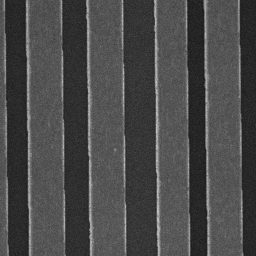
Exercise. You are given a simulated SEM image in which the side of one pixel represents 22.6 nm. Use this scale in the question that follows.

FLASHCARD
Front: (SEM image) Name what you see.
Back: lines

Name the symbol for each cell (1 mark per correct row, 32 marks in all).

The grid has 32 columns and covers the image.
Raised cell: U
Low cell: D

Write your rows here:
UDDUUUUUDDDUUUUDDDDUUUUDDDUUUUDD
UDDUUUUUDDDUUUUDDDDUUUUDDDUUUUDD
UDDUUUUUDDDUUUUDDDDUUUUDDDUUUUDD
UDDUUUUUDDDUUUUDDDDUUUUDDDUUUUDD
UDDUUUUUDDDUUUUDDDDUUUUDDDUUUUDD
UDDUUUUUDDDUUUUDDDDUUUUDDDUUUUDD
UDDUUUUUDDDUUUUDDDDUUUUDDDUUUUDD
UDDUUUUUDDDUUUUDDDDUUUUDDDUUUUDD
UDDUUUUUDDDUUUUDDDDUUUUDDDUUUUDD
UDDUUUUUDDDUUUUDDDDUUUUDDDUUUUDD
UDDUUUUUDDDUUUUDDDDUUUUDDDUUUUDD
UDDUUUUUDDDUUUUDDDDDUUUDDDUUUUDD
UDDUUUUUDDDUUUUDDDDDUUUDDDUUUUDD
UDDUUUUUDDDUUUUDDDDDUUUDDDUUUUDD
UDDUUUUUDDDUUUUDDDDDUUUDDDUUUUDD
UDDUUUUUDDDUUUUDDDDDUUUDDDUUUUDD
UDDDUUUUDDDUUUUDDDDDUUUDDDUUUUDD
UDDDUUUUDDDUUUUUDDDDUUUDDDUUUUDD
UDDDUUUUDDDUUUUUDDDDUUUUDDUUUUDD
UDDDUUUUDDDUUUUUDDDDUUUUDDUUUUDD
UDDDUUUUDDDUUUUUDDDDUUUUDDUUUUDD
UDDDUUUUDDDUUUUUDDDDUUUUDDUUUUDD
UDDDUUUUDDDUUUUUDDDDUUUUDDUUUUDD
UDDDUUUUDDDUUUUUDDDDUUUUDDUUUUDD
UDDDUUUUDDDUUUUUDDDDUUUUDDUUUUDD
UDDDUUUUDDDUUUUUDDDDUUUUDDUUUUDD
UDDDUUUUDDDUUUUUDDDDUUUUDDUUUUDD
UDDDUUUUDDDUUUUUDDDDUUUUDDUUUUDD
UDDDUUUUDDDUUUUUDDDDUUUUDDUUUUDD
UDDDUUUUDDDUUUUUDDDDUUUUDDUUUUDD
UDDDUUUUDDDUUUUUDDDDUUUUDDUUUUDD
UDDDUUUUDDDUUUUUDDDDUUUUDDUUUUDD